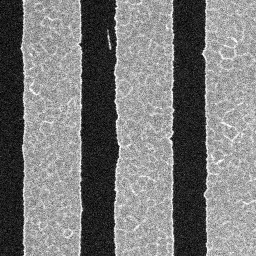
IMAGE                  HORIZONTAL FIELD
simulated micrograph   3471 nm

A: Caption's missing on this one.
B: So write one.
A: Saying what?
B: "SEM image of one or a few lines or trenches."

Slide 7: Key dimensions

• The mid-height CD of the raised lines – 56 px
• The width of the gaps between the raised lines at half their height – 464 nanometers